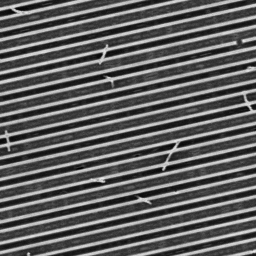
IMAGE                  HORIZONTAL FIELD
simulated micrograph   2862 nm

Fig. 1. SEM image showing parallel lines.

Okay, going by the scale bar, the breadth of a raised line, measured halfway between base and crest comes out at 2.92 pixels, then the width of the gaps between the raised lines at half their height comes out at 0.0642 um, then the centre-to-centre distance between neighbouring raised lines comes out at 0.116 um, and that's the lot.